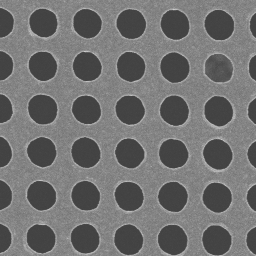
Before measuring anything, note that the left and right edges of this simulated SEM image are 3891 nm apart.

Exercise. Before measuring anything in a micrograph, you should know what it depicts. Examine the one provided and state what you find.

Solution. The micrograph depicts a regular array of holes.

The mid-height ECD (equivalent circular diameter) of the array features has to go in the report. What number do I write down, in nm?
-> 450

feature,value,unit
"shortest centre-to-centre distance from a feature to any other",653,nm